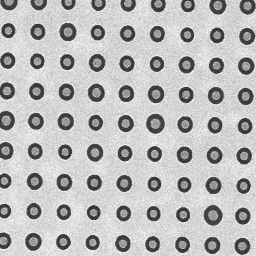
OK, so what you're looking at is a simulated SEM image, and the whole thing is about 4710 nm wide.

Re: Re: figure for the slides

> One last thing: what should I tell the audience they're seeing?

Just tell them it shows a regular array of ring-shaped grooves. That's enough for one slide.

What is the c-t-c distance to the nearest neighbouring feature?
546 nm